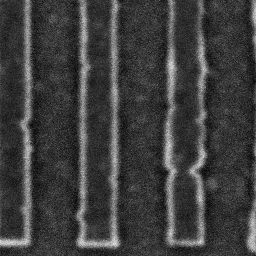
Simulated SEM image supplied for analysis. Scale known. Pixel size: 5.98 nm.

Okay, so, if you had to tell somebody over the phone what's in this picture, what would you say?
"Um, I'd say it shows one or a few lines or trenches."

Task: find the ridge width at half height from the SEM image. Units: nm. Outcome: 196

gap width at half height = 324 nm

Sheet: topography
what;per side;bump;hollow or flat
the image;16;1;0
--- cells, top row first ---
1100011000011000
1100011000011000
1100011000011000
1100011000011000
1100011000011000
1100011000011000
1100011000011000
1100011000011000
1100011000111000
1100011000111000
1100011000010000
1100011000010000
1100011000011000
1100011000011000
1100011000011000
0000000000000000